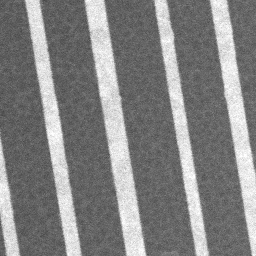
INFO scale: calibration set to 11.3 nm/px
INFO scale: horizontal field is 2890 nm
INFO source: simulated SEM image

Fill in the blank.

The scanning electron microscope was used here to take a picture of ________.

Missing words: one or a few lines or trenches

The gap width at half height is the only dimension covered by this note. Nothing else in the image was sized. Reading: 504 nanometers